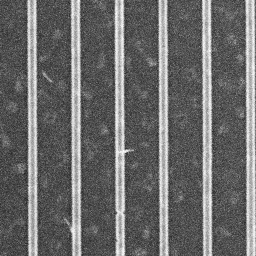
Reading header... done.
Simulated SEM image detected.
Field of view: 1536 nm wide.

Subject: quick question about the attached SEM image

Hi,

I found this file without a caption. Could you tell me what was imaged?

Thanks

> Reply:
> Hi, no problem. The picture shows parallel lines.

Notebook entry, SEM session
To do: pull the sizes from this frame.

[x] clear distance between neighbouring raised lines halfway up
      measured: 222 nm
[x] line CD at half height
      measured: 40.5 nanometres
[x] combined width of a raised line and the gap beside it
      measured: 262 nm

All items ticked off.